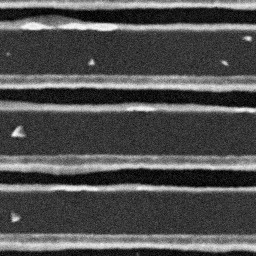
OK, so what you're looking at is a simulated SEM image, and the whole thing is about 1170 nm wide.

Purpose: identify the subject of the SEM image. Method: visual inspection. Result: lines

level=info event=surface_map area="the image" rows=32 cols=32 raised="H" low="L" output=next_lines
HHHHHHHHHHHHHHHHHHHHHHHHHHHHHHHH
LLLLLLLLLLLLLLLLLLLLLLLLLLLLLLLL
LLLLLLLLLLLLLLLLLLLLLLLLLLLLLLLL
HHHHHHHHHHHHHHHHHHHHHHHHHHHHHHHH
HHHHHHHHHHHHHHHHHHHHHHHHHHHHHHHH
HHHHHHHHHHHHHHHHHHHHHHHHHHHHHHHH
HHHHHHHHHHHHHHHHHHHHHHHHHHHHHHHH
HHHHHHHHHHHHHHHHHHHHHHHHHHHHHHHH
HHHHHHHHHHHHHHHHHHHHHHHHHHHHHHHH
HHHHHHHHHHHHHHHHHHHHHHHHHHHHHHHH
HHHHHHHHHHHHHHHHHHHHHHHHHHHHHHHH
LLLLLLLLLLLLLLLLLLLLLLLLLLLLLLLL
LLLLLLLLLLLLLLLLLLLLLLLLLLLLLLLL
HHHHHHHLLLLLLLHHHHHHHHLHHLLLLLLL
HHHHHHHHHHHHHHHHHHHHHHHHHHHHHHHH
HHHHHHHHHHHHHHHHHHHHHHHHHHHHHHHH
HHHHHHHHHHHHHHHHHHHHHHHHHHHHHHHH
HHHHHHHHHHHHHHHHHHHHHHHHHHHHHHHH
HHHHHHHHHHHHHHHHHHHHHHHHHHHHHHHH
HHHHHHHHHHHHHHHHHHHHHHHHHHHHHHHH
HHHHHHHHHHHHHHHHHHHHHHHHHHHHHHHH
LLLLLLLLLLLLLLLLLLLLLLLLLLLLLLLL
LLLLLLLLLLLLLLLLLLLLLLLLLLLLLLLL
HLHHHHHHHHHHLLHHHHHLHLLLLLLLLLLL
HHHHHHHHHHHHHHHHHHHHHHHHHHHHHHHH
HHHHHHHHHHHHHHHHHHHHHHHHHHHHHHHH
HHHHHHHHHHHHHHHHHHHHHHHHHHHHHHHH
HHHHHHHHHHHHHHHHHHHHHHHHHHHHHHHH
HHHHHHHHHHHHHHHHHHHHHHHHHHHHHHHH
HHHHHHHHHHHHHHHHHHHHHHHHHHHHHHHH
HHHHHHHHHHHHHHHHHHHHHHHHHHHHHHHH
LLLLLLLLLLLLLLLLLLLLLLLLLLLLLLLL